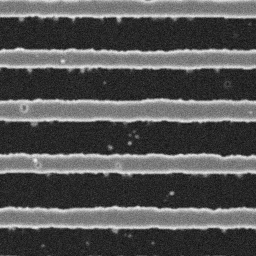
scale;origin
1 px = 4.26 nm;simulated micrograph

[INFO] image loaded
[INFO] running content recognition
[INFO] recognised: lines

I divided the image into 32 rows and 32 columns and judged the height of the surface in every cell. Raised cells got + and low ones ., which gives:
++++++++++++++++++++++++++++++++
++++++++++++++++++++++++++++++++
................................
................................
................................
................................
++++++++++++++++++++++++++++++++
++++++++++++++++++++++++++++++++
................++++.+++++....++
................................
................................
................................
....++.+..........+++...........
++++++++++++++++++++++++++++++++
++++++++++++++++++++++++++++++++
................................
................................
................................
................................
++++++++++++++++++++++++++++.+.+
++++++++++++++++++++++++++++++++
++++++++++++++++++++++++++++++++
................................
................................
................................
................................
++++++++++++++++++++++++++++++++
++++++++++++++++++++++++++++++++
...++...++++++++++++++++++.+++++
................................
................................
................................